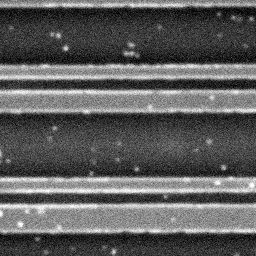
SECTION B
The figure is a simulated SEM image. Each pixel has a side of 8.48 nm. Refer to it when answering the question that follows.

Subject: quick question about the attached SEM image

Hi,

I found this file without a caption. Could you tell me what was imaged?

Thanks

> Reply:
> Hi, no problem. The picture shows lines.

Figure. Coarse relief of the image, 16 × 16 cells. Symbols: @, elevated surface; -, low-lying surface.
----------------
----------------
----------------
----------------
@@@@@@@@@@@@@@@@
@@@@@@@@@@@@@@@@
@@@@@@@@@@@@@@@@
----------------
----------------
----------------
----------------
@@@@@@@@@@@@@@@@
@@@@@@@@@@@@@@@@
@@@@@@@@@@@@@@@@
----------------
----------------